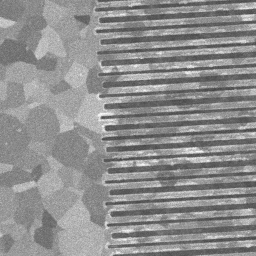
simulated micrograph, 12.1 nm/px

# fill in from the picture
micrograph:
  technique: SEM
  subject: parallel lines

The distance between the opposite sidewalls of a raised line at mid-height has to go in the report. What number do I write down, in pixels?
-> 5.49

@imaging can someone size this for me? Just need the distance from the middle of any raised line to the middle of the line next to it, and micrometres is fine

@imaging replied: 0.131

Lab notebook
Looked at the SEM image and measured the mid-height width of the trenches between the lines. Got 4.11 pixels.